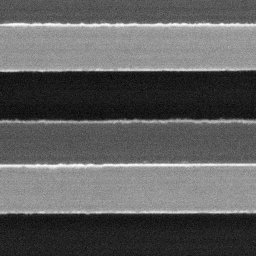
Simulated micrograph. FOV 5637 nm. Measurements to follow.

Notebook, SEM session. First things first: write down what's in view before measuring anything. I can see lines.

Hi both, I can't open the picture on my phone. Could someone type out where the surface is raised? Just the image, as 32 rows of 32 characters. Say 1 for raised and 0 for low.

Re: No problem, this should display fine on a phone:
11111111111111111111111111111111
11111111111111111111111111111111
11111111111111111111111111111111
11111111111111111111111111111111
11111111111111111111111111111111
11111111111111111111111111111111
11111111111111111111111111111111
11111111111111111111111111111111
11111111111111111111111111111111
00000000000000000000000000000000
00000000000000000000000000000000
00000000000000000000000000000000
00000000000000000000000000000000
00000000000000000000000000000000
00000000000000000000000000000000
11111111111111111111111111111111
11111111111111111111111111111111
11111111111111111111111111111111
11111111111111111111111111111111
11111111111111111111111111111111
11111111111111111111111111111111
11111111111111111111111111111111
11111111111111111111111111111111
11111111111111111111111111111111
11111111111111111111111111111111
11111111111111111111111111111111
11111111111111111111111110111000
00000000000000000000000000000000
00000000000000000000000000000000
00000000000000000000000000000000
00000000000000000000000000000000
00000000000000000000000000000000